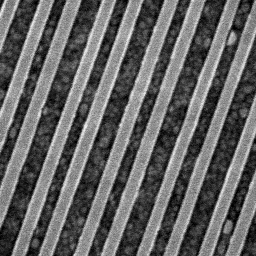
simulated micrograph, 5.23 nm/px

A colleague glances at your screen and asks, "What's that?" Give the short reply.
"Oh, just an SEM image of parallel lines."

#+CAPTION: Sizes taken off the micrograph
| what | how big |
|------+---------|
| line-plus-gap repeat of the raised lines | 152 nm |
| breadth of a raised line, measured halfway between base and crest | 64.6 nm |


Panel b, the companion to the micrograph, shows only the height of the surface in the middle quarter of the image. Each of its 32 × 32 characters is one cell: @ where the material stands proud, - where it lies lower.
----@@@----@@@-----@@@@---@@@---
----@@@---@@@------@@@----@@@---
---@@@----@@@------@@@---@@@@---
---@@@---@@@@-----@@@@---@@@----
---@@@---@@@------@@@----@@@----
--@@@----@@@------@@@---@@@@----
--@@@---@@@@-----@@@@---@@@-----
-@@@@---@@@------@@@----@@@-----
-@@@----@@@------@@@---@@@@-----
-@@@---@@@@-----@@@----@@@------
@@@----@@@------@@@----@@@-----@
@@@-@--@@@-----@@@@---@@@@-----@
@@@---@@@@-----@@@----@@@------@
@@----@@@------@@@----@@@-----@@
@@----@@@-----@@@@---@@@------@@
@@---@@@------@@@----@@@------@@
@----@@@------@@@----@@@-----@@@
@---@@@@-----@@@@---@@@------@@@
@---@@@------@@@----@@@------@@@
----@@@--@@--@@@---@@@@-----@@@-
---@@@@-----@@@@---@@@------@@@-
---@@@------@@@----@@@------@@@-
---@@@------@@@---@@@@-----@@@--
--@@@@-----@@@----@@@------@@@--
--@@@------@@@----@@@------@@@--
--@@@-----@@@@---@@@@-----@@@---
-@@@@-----@@@----@@@-@@---@@@---
-@@@------@@@----@@@--@--@@@----
-@@@-----@@@@---@@@@-----@@@----
@@@@-----@@@----@@@------@@@----
@@@------@@@----@@@-----@@@----@
@@@-----@@@@---@@@------@@@----@